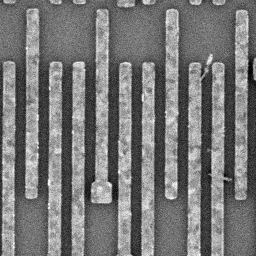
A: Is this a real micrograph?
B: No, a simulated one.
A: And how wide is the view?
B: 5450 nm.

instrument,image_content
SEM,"wiring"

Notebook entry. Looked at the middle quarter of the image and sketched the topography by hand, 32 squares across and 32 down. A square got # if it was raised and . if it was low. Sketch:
..###...###...###...###...##....
..###...###...###...###...##...#
..###...###...###...###...##...#
..###...###...###...###...##...#
..###...###...###...###...##...#
..###...###...###...###...##...#
..###...###...###...##....##...#
..###...###...###...##....##...#
..###...###...###...##....##...#
..###...###...###...##....##...#
..###...###...###...##....##...#
..###...###...###...##....##...#
..###...###...###...###...##...#
..###...###...###...###...##...#
..###...###...###...###...##...#
..###...###...###...##....##...#
..###...###...###...##....##...#
..###...###...###...##....##...#
..###...###...###...##...###...#
..###...###...###...##...###...#
..###...###...###...##....##...#
..###...###...###...##....##...#
..###...###...###...##....##...#
..###...###...###...##....##...#
..###...###...###...##....##...#
..###...###...###...##....##...#
..###...###...###...##...###...#
..###...###...###...##...###...#
..###...###...###...##...###...#
..###...###...###...##...###...#
..###..#####..###...##....##...#
..###..#####..###...##....##...#